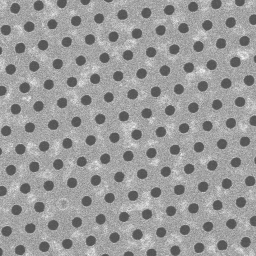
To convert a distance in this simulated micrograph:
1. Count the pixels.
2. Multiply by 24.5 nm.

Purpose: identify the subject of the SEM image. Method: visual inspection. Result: a regular array of holes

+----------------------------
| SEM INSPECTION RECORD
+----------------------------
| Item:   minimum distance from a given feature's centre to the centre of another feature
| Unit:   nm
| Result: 559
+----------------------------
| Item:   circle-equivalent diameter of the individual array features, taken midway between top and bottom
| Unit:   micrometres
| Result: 0.262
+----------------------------